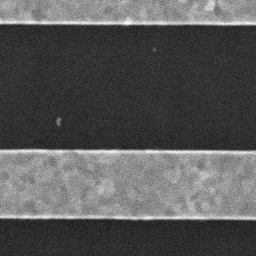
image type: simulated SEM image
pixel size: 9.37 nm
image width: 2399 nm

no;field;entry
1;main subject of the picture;wiring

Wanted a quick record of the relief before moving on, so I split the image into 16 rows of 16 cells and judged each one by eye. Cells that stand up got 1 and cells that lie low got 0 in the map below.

1111111111111111
0000000111111111
0000000000000000
0000000000000000
0000000000000000
0000000000000000
0000000000000000
0000000000000000
0000000000000000
1111111111111111
1111111111111111
1111111111111111
1111111111111111
1111111111111111
0000000000000000
0000000000000000